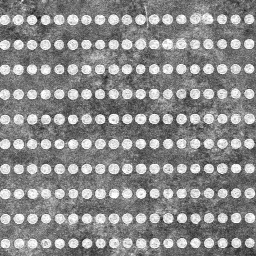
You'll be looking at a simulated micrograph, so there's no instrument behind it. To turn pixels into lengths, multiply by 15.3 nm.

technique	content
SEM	a regular array of raised bodies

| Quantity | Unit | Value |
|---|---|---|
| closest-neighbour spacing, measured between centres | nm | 205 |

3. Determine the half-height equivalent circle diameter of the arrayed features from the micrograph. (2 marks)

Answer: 0.144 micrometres